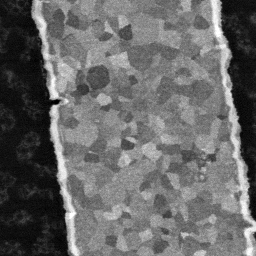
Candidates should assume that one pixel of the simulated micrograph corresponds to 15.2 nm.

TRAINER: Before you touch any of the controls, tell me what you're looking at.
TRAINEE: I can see one or a few lines or trenches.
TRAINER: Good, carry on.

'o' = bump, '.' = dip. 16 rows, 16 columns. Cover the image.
..ooooooooooo...
...ooooooooooo..
...ooooooooooo..
...ooooooooooo..
...ooooooooooo..
...ooooooooooo..
....oooooooooo..
...oooooooooooo.
...oooooooooooo.
....ooooooooooo.
....ooooooooooo.
....ooooooooooo.
....ooooooooooo.
.....oooooooooo.
.....ooooooooooo
.....ooooooooooo